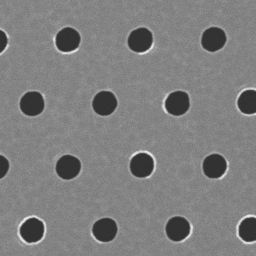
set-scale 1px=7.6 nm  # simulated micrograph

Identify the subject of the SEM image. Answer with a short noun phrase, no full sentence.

a regular array of holes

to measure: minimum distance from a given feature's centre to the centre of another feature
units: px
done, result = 72.5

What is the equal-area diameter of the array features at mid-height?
190 nm